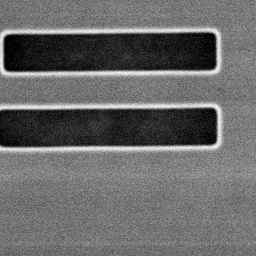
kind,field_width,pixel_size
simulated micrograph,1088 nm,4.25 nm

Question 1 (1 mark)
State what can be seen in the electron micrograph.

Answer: groups of lines, slits or small figures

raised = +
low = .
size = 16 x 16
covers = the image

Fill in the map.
++++++++++++++++
++++++++++++++++
..............++
..............++
+...........++++
++++++++++++++++
++++++++++++++++
..............++
..............++
++++++++++++++++
++++++++++++++++
++++++++++++++++
++++++++++++++++
++++++++++++++++
++++++++++++++++
++++++++++++++++